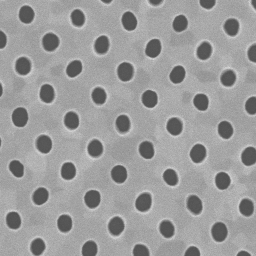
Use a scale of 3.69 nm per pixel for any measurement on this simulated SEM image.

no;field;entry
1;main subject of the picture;a regular array of holes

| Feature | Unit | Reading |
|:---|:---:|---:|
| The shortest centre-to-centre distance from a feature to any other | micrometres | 0.132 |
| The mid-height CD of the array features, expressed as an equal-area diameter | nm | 62.6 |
